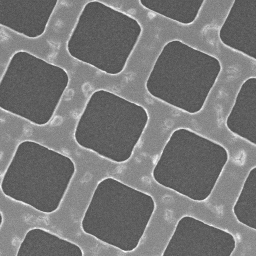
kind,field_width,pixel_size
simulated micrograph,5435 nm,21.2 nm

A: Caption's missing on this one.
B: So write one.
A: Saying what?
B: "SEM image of holes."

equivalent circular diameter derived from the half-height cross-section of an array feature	1420	nm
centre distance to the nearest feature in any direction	1860	nm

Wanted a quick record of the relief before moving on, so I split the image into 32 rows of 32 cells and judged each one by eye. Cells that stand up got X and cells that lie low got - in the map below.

-------XXXX--XXXXX-------XXXX---
-------XXX-----XXXX------XXXX---
------XXXX-------XXXXX--XXXX----
X-----XXX---------XXXXXXXXXX----
XXXX-XXXX--------XXXXXXXXXX-----
XXXXXXXX---------XXXX--XXXXX----
XXXXXXXXX-------XXXX-----XXXXX--
X----XXXXX------XXXX-------XXXXX
X-------XXXX---XXXX---------XXXX
--------XXXXXXXXXXX--------XXXXX
--------XXXXXXXXXX---------XXX--
--------XXXX--XXXXX-------XXXX--
-------XXXX-----XXXX------XXX---
-------XXXX-------XXXXX--XXXX---
XX-----XXX--------XXXXXXXXXXX---
XXXX--XXXX--------XXXXXXXXXX----
XXXXXXXXX---------XXXX--XXXXX---
XXXXXXXXXX-------XXXX-----XXXXX-
XX----XXXXX------XXXX-------XXXX
XX------XXXXX---XXXX--------XXXX
X--------XXXXXXXXXXX--------XXXX
X--------XXXXXXXXXX---------XXX-
---------XXXX-XXXXX--------XXXX-
--------XXXX-----XXXX------XXX--
X-------XXXX-------XXXX---XXXX--
XXX----XXXX--------XXXXXXXXXX---
XXXXX-XXXXX--------XXXXXXXXXX---
XXXXXXXXXX---------XXXX--XXXXX--
XXXXXXXXXX--------XXXX-----XXXXX
XXX----XXXXX------XXXX-------XXX
XXX------XXXXX---XXXX--------XXX
XX--------XXXXXXXXXXX--------XXX